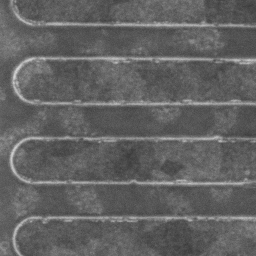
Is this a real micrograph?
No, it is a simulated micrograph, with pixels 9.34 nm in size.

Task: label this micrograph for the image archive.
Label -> one or a few lines or trenches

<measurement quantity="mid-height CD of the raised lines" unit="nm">419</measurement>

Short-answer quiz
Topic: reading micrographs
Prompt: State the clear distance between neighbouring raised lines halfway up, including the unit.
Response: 320 nm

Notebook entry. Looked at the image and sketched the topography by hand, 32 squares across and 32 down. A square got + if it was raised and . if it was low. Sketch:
..++++++++++++++++++++++++++++++
..++++++++++++++++++++++++++++++
...+++++++++++++++++++++++++++++
................................
................................
................................
................................
....++++++++++++++++++++++++....
..++++++++++++++++++++++++++++++
..++++++++++++++++++++++++++++++
..++++++++++++++++++++++++++++++
..++++++++++++++++++++++++++++++
...+++++++++++++++++++++++++++++
................................
................................
................................
................................
...+++++++++++++++++++++++++++++
..++++++++++++++++++++++++++++++
..++++++++++++++++++++++++++++++
..++++++++++++++++++++++++++++++
..++++++++++++++++++++++++++++++
...+++++++++++++++++++++++++++++
................................
................................
................................
................................
...+++++++++++++++++++++++++++++
..++++++++++++++++++++++++++++++
..++++++++++++++++++++++++++++++
..++++++++++++++++++++++++++++++
..++++++++++++++++++++++++++++++